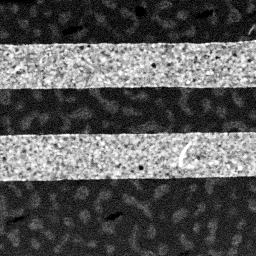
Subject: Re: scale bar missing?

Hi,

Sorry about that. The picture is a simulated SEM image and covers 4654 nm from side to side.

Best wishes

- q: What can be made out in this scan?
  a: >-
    one or a few lines or trenches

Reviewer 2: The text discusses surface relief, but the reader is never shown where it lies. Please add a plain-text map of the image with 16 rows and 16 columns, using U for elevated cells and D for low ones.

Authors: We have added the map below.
DDDDDDDDDDDDDDDD
DDDDDDDDDDDDDDDD
DDDDDDDDDDDDDDDD
UUUUUUUUUUUUUUUU
UUUUUUUUUUUUUUUU
UUUDDDDDDDDDDDDD
DDDDDDDDDDDDDDDD
DDDDDDDDDDDDDDDD
DUUUUUUUUUUUUUUU
UUUUUUUUUUUUUUUU
UUUUUUUUUUUUUUUU
DDDDDDDDDDDDDDDD
DDDDDDDDDDDDDDDD
DDDDDDDDDDDDDDDD
DDDDDDDDDDDDDDDD
DDDDDDDDDDDDDDDD